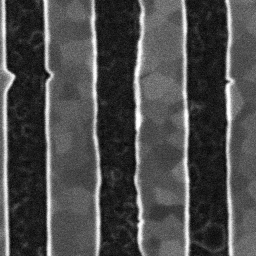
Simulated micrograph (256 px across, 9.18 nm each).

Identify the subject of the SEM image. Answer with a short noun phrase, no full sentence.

one or a few lines or trenches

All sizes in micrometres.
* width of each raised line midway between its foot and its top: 0.448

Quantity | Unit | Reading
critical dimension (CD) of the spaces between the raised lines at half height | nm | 383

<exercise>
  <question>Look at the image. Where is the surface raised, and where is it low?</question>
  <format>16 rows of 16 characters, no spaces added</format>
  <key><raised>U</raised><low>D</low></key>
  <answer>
DDDUUUDDDUUUDDUU
DDDUUUDDDUUUDDUU
DDDUUUDDDUUUDDUU
DDDUUUDDDUUUDDUU
UDDUUUDDDUUUDDUU
UDDUUUDDDUUUDDUU
DDDUUUDDDUUUDDUU
DDDUUUDDDUUUDDUU
DDDUUUDDDUUUDDUU
DDDUUUDDDUUUDDUU
DDDUUUDDDUUUDDUU
DDDUUUDDUUUUDDUU
DDDUUUDDDUUUDDUU
DDDUUUDDDUUUDDUU
DDDUUUDDDUUUDDUU
UDDUUUDDDUUUDDUU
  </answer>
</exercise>